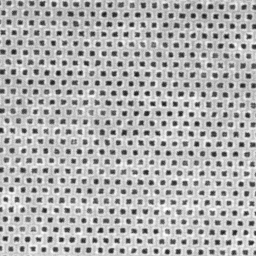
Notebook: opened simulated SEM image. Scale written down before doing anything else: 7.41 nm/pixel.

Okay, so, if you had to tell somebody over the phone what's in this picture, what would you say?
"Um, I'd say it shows a regular array of holes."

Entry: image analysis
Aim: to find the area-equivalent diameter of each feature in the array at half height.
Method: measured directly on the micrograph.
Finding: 0.0495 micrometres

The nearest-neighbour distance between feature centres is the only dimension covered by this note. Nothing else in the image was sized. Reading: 10.9 pixels